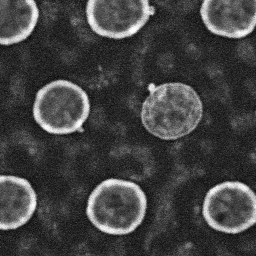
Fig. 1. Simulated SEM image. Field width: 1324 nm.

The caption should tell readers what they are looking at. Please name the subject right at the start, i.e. raised bodies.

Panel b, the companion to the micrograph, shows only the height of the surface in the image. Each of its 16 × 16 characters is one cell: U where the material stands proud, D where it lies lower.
UUDDDDUUUDDDDUUU
UUDDDDUUUDDDDUUU
UDDDDDDDDDDDDDDD
DDDDDDDDDDDDDDDD
DDDDDDDDDDDDDDDD
DDDUUDDDDDDDDDDD
DDUUUDDDDDDDDDDD
DDUUUDDDDDDDDDDD
DDDDDDDDDDDDDDDD
DDDDDDDDDDDDDDDD
DDDDDDDDDDDDDDDD
UUDDDDDUDDDDDDDD
UUDDDDUUUDDDDUUU
UUDDDDUUUDDDDUUU
DDDDDDDDDDDDDDDD
DDDDDDDDDDDDDDDD